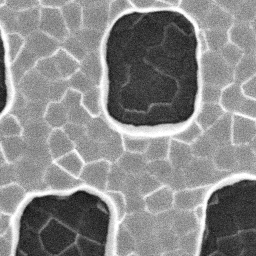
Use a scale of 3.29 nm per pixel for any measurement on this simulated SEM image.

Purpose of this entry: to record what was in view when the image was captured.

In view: holes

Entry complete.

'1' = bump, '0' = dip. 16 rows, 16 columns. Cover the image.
1111111111111111
1111111000001111
1111111000001111
1111111000001111
1111111000001111
0111111000001111
1111111000001111
1111111000001111
1111111111111111
1111111111111111
1111111111111111
1111111111111100
1100000111111000
1000000111111000
1000000111111000
1000000111110000